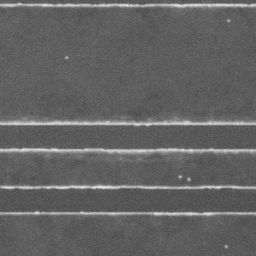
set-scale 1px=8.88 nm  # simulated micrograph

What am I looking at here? lines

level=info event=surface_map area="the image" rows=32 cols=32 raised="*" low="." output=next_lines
..*.............................
********************************
********************************
********************************
********************************
********************************
********************************
********************************
********************************
********************************
********************************
********************************
********************************
********************************
********************************
********************************
................................
................................
................................
********************************
********************************
********************************
********************************
**********..***..***********.***
................................
................................
................................
********************************
********************************
********************************
********************************
********************************